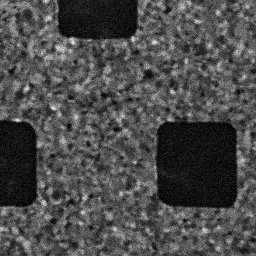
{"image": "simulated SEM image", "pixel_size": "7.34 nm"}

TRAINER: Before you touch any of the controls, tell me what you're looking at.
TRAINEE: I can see holes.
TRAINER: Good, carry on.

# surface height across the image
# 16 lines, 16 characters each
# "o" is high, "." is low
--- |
oooo.....ooooooo
oooo.....ooooooo
oooooooooooooooo
oooooooooooooooo
oooooooooooooooo
oooooooooooooooo
oooooooooooooooo
.ooooooooooooooo
..oooooooo.....o
..oooooooo.....o
..oooooooo.....o
..oooooooo.....o
..oooooooo.....o
oooooooooooooooo
oooooooooooooooo
oooooooooooooooo